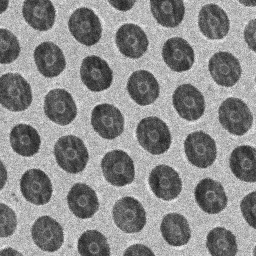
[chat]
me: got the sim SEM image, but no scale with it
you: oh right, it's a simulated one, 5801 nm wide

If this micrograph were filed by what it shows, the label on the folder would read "a regular array of ring-shaped grooves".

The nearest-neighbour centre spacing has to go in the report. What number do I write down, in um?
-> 1.09